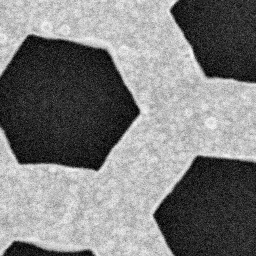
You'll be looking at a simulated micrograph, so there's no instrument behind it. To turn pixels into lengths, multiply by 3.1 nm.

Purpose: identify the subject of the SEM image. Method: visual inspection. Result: holes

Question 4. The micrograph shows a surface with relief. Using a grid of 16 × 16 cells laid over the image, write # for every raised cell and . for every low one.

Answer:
###########.....
###########.....
##..########....
#......#####....
.......######...
........########
.........#######
........########
........########
#......#########
#####.######....
###########.....
##########......
##########......
##########......
...########.....